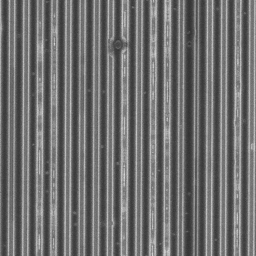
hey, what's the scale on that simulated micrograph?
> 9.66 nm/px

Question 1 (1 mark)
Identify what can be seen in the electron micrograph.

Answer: parallel lines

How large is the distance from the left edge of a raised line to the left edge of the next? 0.137 micrometres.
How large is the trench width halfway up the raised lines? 45.9 nm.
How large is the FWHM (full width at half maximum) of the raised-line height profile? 9.5 px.